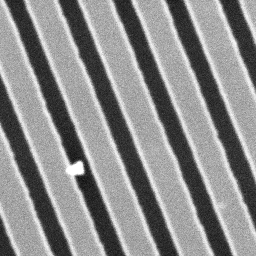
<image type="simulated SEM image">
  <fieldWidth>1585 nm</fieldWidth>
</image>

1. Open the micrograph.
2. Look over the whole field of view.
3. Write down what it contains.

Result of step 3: lines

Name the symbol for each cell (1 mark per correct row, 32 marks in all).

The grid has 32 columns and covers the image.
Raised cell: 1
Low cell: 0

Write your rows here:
10011110001111000111100111110011
10001111001111000111100011110011
10001111000111100111100011110001
11000111100111100011110001111001
11000111100011110011110001111000
11100111100011110001111001111000
11100011110011111001111000111100
11100011110001111000111000111100
11110011111001111000111100111110
11110001111000111100111100011110
01111001111000111100011110011110
01111000111100111110011110001111
01111000111100011110011110001111
00111100011110011110001111001111
00111100011110001111001111000111
00011110011110001111000111100111
00011110001111001111100111100011
10011111001111000111100011100011
10001111001111000111100011110011
11001111000111100111110011110001
11000111110111100011110001111001
11000111110011110011111001111000
11100111100011110001111001111000
11100011110011111001111000111100
11110011110001111000111100111100
11110001111001111000111100011110
11110001111000111100111110011110
11111001111000111100011110011110
01111000111100111100011110001111
01111100111100011110011111001111
01111100011110011110001111000111
00111100011110001111001111000111